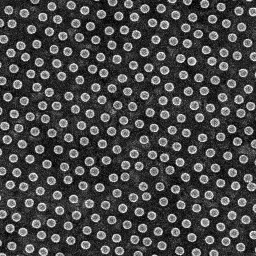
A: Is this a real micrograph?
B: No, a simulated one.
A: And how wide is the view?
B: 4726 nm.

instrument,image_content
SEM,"a regular array of raised bodies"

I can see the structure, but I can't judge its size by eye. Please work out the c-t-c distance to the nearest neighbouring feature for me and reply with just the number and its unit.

0.264 um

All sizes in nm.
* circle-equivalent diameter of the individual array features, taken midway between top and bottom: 152